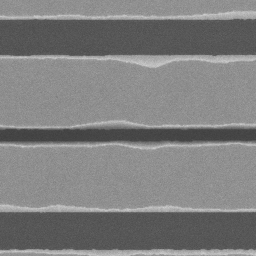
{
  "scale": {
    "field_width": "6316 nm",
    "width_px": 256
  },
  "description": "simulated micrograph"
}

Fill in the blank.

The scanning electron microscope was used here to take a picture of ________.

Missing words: lines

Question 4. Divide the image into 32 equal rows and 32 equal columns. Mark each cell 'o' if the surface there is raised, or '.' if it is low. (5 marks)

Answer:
oooooooooooooooooooooooooooooooo
oooooooooooooooooooooooooooooooo
................................
................................
................................
................................
................................
oooooooooooooooooooooooooooooooo
oooooooooooooooooooooooooooooooo
oooooooooooooooooooooooooooooooo
oooooooooooooooooooooooooooooooo
oooooooooooooooooooooooooooooooo
oooooooooooooooooooooooooooooooo
oooooooooooooooooooooooooooooooo
oooooooooooooooooooooooooooooooo
oooooooooooooooooooooooooooooooo
................................
................................
oooooooooooooooooooooooooooooooo
oooooooooooooooooooooooooooooooo
oooooooooooooooooooooooooooooooo
oooooooooooooooooooooooooooooooo
oooooooooooooooooooooooooooooooo
oooooooooooooooooooooooooooooooo
oooooooooooooooooooooooooooooooo
oooooooooooooooooooooooooooooooo
................................
................................
................................
................................
................................
oooooooooo.......o.ooo...o..oooo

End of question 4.